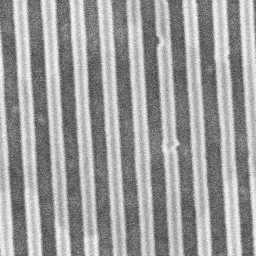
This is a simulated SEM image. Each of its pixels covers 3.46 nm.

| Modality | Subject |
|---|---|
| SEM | parallel lines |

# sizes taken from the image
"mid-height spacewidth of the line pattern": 63.4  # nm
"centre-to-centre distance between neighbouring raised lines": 98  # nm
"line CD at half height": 36.7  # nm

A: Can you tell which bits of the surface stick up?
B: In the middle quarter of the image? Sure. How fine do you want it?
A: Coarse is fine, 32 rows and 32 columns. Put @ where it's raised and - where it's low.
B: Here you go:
---@@-----@@-----@@-----@@-----@
---@@-----@@-----@@@----@@@----@
---@@-----@@-----@@@----@@@----@
---@@-----@@-----@@@----@@@----@
---@@-----@@-----@@@----@@@----@
---@@-----@@@----@@@----@@@----@
---@@@----@@@----@@@----@@@----@
---@@@----@@@----@@@----@@@----@
---@@@----@@@----@@@-----@@-----
----@@-----@@-----@@-----@@-----
----@@-----@@-----@@-----@@-----
----@@-----@@-----@@-----@@-----
----@@-----@@-----@@-----@@-----
----@@-----@@-----@@-----@@-----
----@@-----@@-----@@-----@@-----
----@@-----@@-----@@-----@@-----
----@@-----@@-----@@-----@@-----
----@@-----@@-----@@-----@@@----
----@@-----@@-----@@@----@@@----
----@@-----@@-----@@@----@@@----
----@@@----@@-----@@@----@@@----
----@@-----@@-----@@@----@@@----
----@@@----@@@----@@@-----@@----
----@@@----@@@----@@@-----@@----
----@@@----@@@----@@@-----@@----
----@@@-----@@-----@@-----@@----
----@@@-----@@-----@@-----@@----
----@@@-----@@-----@@-----@@----
----@@@-----@@-----@@-----@@----
-----@@-----@@-----@@-----@@----
-----@@-----@@-----@@-----@@----
-----@@-----@@-----@@-----@@----